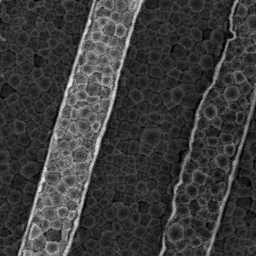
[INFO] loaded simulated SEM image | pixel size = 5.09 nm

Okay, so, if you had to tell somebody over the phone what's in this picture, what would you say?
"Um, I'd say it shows one or a few lines or trenches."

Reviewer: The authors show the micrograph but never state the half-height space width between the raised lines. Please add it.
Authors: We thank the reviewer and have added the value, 445 nanometres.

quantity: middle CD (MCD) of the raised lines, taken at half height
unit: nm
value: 237